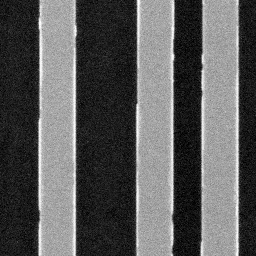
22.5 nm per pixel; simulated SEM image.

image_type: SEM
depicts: lines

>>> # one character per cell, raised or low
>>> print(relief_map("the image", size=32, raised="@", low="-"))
-----@@@@--------@@@@@---@@@@@--
-----@@@@--------@@@@@---@@@@@--
-----@@@@--------@@@@@---@@@@@--
-----@@@@--------@@@@@---@@@@@--
-----@@@@--------@@@@@---@@@@@--
-----@@@@--------@@@@@---@@@@@--
-----@@@@--------@@@@@---@@@@@--
-----@@@@--------@@@@@---@@@@@--
-----@@@@--------@@@@@---@@@@@--
-----@@@@--------@@@@@---@@@@@--
-----@@@@--------@@@@@---@@@@@--
-----@@@@--------@@@@@---@@@@@--
-----@@@@--------@@@@@---@@@@@--
-----@@@@--------@@@@@---@@@@@--
-----@@@@--------@@@@@---@@@@@--
-----@@@@--------@@@@@---@@@@@--
-----@@@@--------@@@@@---@@@@@--
-----@@@@--------@@@@@---@@@@@--
-----@@@@--------@@@@@---@@@@@--
-----@@@@--------@@@@@---@@@@@--
-----@@@@--------@@@@@---@@@@@--
-----@@@@--------@@@@@---@@@@@--
-----@@@@--------@@@@@---@@@@@--
-----@@@@--------@@@@@---@@@@@--
-----@@@@--------@@@@@---@@@@@--
-----@@@@--------@@@@@---@@@@@--
-----@@@@--------@@@@@---@@@@@--
-----@@@@--------@@@@----@@@@@--
-----@@@@--------@@@@@---@@@@@--
-----@@@@--------@@@@@---@@@@@--
-----@@@@--------@@@@@---@@@@@--
-----@@@@--------@@@@----@@@@@--